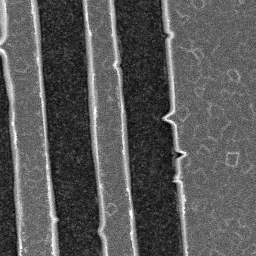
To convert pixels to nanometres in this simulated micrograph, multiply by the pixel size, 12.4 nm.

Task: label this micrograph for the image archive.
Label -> one or a few lines or trenches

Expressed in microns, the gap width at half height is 0.598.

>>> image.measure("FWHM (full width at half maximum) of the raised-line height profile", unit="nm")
391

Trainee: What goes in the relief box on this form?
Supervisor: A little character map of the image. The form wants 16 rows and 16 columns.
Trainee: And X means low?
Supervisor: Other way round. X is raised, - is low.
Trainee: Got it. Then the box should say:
XX---XX---XXXXXX
XX---XX---XXXXXX
XX---XX---XXXXXX
XXX---X----XXXXX
XXX---X----XXXXX
XXX---XX---XXXXX
-XX---XX---XXXXX
-XX---XX---XXXXX
-XX---XX---XXXXX
-XX---XX---XXXXX
-XX---XX---XXXXX
-XX---XX---XXXXX
-XX---XX---XXXXX
-XX---XX---XXXXX
-XX---XX---XXXXX
-XXX--XX----XXXX